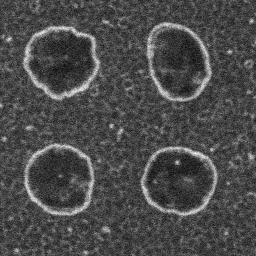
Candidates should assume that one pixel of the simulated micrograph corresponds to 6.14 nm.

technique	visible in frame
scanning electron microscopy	raised bodies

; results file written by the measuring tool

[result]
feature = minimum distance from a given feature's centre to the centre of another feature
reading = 118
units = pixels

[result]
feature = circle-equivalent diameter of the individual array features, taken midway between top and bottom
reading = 0.426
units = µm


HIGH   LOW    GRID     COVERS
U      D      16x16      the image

DDDDDDDDDDDDDDDD
DDDDDDDDDDDDDDDD
DDUUUUDDDUUUDDDD
DDUUUUDDDUUUUDDD
DDUUUUDDDUUUUDDD
DDDUUDDDDDUUUDDD
DDDDDDDDDDDDDDDD
DDDDDDDDDDDDDDDD
DDDDDDDDDDDDDDDD
DDUUUDDDDDUUDDDD
DDUUUUDDDUUUUDDD
DDUUUUDDDUUUUDDD
DDUUUUDDDUUUUDDD
DDDDDDDDDDDDDDDD
DDDDDDDDDDDDDDDD
DDDDDDDDDDDDDDDD